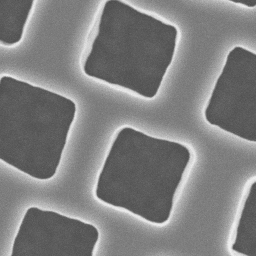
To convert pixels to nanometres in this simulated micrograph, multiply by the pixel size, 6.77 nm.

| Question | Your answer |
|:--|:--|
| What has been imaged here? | holes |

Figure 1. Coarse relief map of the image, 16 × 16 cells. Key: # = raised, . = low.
..####..########
..####....######
.#####.....#####
#####......###..
#####.....####..
...#####..###...
.....########...
.....########...
....###..######.
....###.....####
#...##......####
######.....#####
######.....####.
##..#####..####.
#.....#########.
#.....#########.